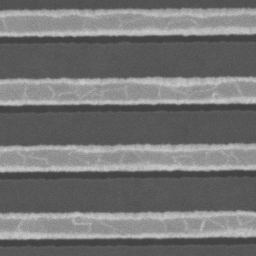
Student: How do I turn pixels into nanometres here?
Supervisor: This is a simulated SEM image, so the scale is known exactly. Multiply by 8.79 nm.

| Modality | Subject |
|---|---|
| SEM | lines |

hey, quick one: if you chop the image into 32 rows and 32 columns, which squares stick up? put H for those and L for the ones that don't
LLLLLLLLLLLLLLLLLLLLLLLLLLLLLLLL
LLHHHHLHHHHHHHHHHHHHHHHHHHHHHHHH
HHHHHHHHHHHHHHHHHHHHHHHHHHHHHHHH
HHHHHHHHHHHHHHHHHHHHHHHHHHHHHHHH
LHLLLLLLLLLLLLLLLLLLLLLLLLLLLLLL
LLLLLLLLLLLLLLLLLLLLLLLLLLLLLLLL
LLLLLLLLLLLLLLLLLLLLLLLLLLLLLLLL
LLLLLLLLLLLLLLLLLLLLLLLLLLLLLLLL
LLLLLLLLLLLLLLLLLLLLLLLLLLLLLLLL
LLLLLLLLLLLLLLLLLLLLLLLLLLLLLLLL
HHHHHHHHHHHHHHHHHHHHHHHHHHHHHHHH
HHHHHHHHHHHHHHHHHHHHHHHHHHHHHHHH
HHHHHHHHHHHHHHHHHHHHHHHHHHHHHHHH
LLLLLLLLLLLLLLLLLLLLLLLLLLLLLLLL
LLLLLLLLLLLLLLLLLLLLLLLLLLLLLLLL
LLLLLLLLLLLLLLLLLLLLLLLLLLLLLLLL
LLLLLLLLLLLLLLLLLLLLLLLLLLLLLLLL
LLLLLLLLLLLLLLLLLLLLLLLLLLLLLLLL
HHHHHHHHHHHHHHHHHHHHHHHHHHHHHHHH
HHHHHHHHHHHHHHHHHHHHHHHHHHHHHHHH
HHHHHHHHHHHHHHHHHHHHHHHHHHHHHHHH
LLLLLLLLLLLLLLLLLLLLLLLLLLLLLLLL
LLLLLLLLLLLLLLLLLLLLLLLLLLLLLLLL
LLLLLLLLLLLLLLLLLLLLLLLLLLLLLLLL
LLLLLLLLLLLLLLLLLLLLLLLLLLLLLLLL
LLLLLLLLLLLLLLLLLLLLLLLLLLLLLLLL
LLLLLLLLLLLLLLLLLLLLLLLLLLLLLLLL
HHHHHHHHHHHHHHHHHHHHHHHHHHHHHHHH
HHHHHHHHHHHHHHHHHHHHHHHHHHHHHHHH
HHHHHHHHHHHHHHHHHHHHHHHHHHHHHHHL
LLLLLLLLLLLLLLLLLLLLLLLLLLLLLLLL
LLLLLLLLLLLLLLLLLLLLLLLLLLLLLLLL